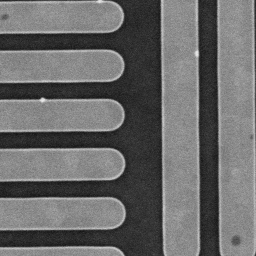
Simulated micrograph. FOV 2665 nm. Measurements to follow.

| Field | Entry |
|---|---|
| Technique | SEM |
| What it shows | groups of lines, slits or small figures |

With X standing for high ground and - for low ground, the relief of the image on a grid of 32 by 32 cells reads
XXXXXXXXXXXXXXX-----XXXXX--XXXXX
XXXXXXXXXXXXXXX-----XXXXX--XXXXX
XXXXXXXXXXXXXXX-----XXXXX--XXXXX
XXXXXXXXXXXXXXX-----XXXXX--XXXXX
--------------------XXXXX--XXXXX
--------------------XXXXX--XXXXX
XXXXXXXXXXXXXX------XXXXX--XXXXX
XXXXXXXXXXXXXXX-----XXXXX--XXXXX
XXXXXXXXXXXXXXX-----XXXXX--XXXXX
XXXXXXXXXXXXXXX-----XXXXX--XXXXX
--------------------XXXXX--XXXXX
--------------------XXXXX--XXXXX
-----XXXXXXXXX------XXXXX--XXXXX
XXXXXXXXXXXXXXX-----XXXXX--XXXXX
XXXXXXXXXXXXXXX-----XXXXX--XXXXX
XXXXXXXXXXXXXXX-----XXXXX--XXXXX
--------------------XXXXX--XXXXX
--------------------XXXXX--XXXXX
--------------------XXXXX--XXXXX
XXXXXXXXXXXXXXX-----XXXXX--XXXXX
XXXXXXXXXXXXXXX-----XXXXX--XXXXX
XXXXXXXXXXXXXXX-----XXXXX--XXXXX
XXXXXXXXXXX---------XXXXX--XXXXX
--------------------XXXXX--XXXXX
--------------------XXXXX--XXXXX
XXXXXXXXXXXXXXX-----XXXXX--XXXXX
XXXXXXXXXXXXXXXX----XXXXX--XXXXX
XXXXXXXXXXXXXXX-----XXXXX--XXXXX
XXXXXXXXXXXXXX------XXXXX--XXXXX
--------------------XXXXX--XXXXX
--------------------XXXXX--XXXXX
XXXXXXXXXXXXXXX------XXXX---XXXX